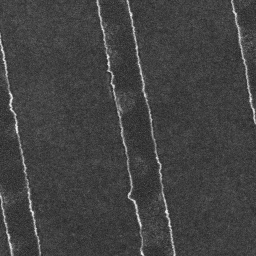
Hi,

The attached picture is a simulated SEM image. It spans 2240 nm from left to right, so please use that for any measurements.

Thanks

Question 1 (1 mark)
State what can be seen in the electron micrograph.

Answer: one or a few lines or trenches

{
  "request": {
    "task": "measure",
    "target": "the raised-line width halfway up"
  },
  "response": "267 nm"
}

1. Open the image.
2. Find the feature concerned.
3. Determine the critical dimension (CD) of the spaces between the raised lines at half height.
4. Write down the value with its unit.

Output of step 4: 890 nm